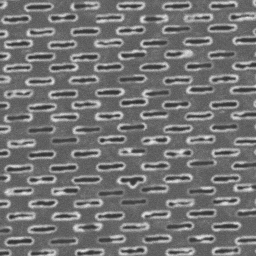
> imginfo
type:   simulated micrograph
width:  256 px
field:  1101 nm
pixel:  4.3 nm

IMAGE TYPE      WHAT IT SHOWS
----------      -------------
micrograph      a regular array of holes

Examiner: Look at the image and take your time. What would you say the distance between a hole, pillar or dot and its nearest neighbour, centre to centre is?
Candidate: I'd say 101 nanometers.